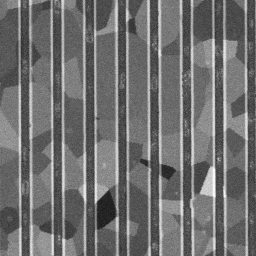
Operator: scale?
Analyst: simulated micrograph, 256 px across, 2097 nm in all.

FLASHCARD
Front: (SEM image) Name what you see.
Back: parallel lines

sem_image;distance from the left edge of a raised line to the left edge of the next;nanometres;265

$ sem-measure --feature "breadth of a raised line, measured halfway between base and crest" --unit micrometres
0.18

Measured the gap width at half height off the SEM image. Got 86 nanometers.